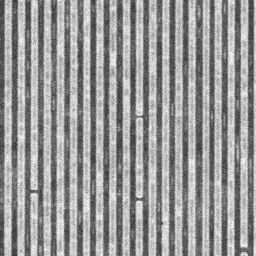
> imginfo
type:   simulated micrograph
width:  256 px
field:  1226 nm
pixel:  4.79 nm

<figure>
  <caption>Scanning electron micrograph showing parallel lines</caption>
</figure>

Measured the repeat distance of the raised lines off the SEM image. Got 0.0627 um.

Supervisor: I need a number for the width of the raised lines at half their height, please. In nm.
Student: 26.3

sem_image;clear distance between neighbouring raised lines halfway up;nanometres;34.7